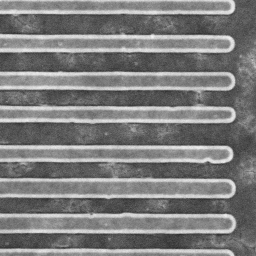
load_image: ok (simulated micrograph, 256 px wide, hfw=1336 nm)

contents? parallel lines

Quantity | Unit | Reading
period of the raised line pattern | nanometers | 188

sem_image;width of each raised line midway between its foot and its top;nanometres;72.5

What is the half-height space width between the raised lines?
106 nanometres